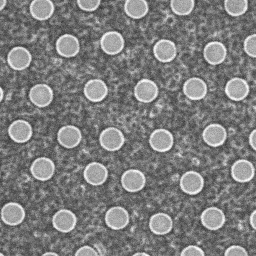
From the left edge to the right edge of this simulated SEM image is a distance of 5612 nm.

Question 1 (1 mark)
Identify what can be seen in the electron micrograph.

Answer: a regular array of raised bodies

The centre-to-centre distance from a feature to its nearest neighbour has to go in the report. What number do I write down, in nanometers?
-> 918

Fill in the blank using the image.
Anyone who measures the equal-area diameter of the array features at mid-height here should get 475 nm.